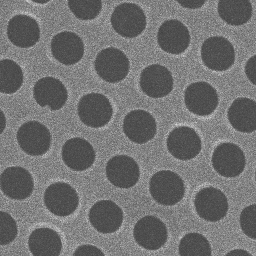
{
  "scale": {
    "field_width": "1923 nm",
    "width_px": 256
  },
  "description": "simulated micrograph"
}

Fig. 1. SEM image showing a regular array of holes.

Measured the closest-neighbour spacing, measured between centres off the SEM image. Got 0.356 microns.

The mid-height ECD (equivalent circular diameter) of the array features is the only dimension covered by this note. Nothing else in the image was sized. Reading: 255 nm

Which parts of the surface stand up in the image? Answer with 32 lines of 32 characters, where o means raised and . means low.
ooooooooo....oo..oooooo..oo....o
ooooooooo...oo....ooooooooo.....
o...oooooooooo....ooo.oooooo...o
o....ooooooooo....oo...ooooooooo
o....oo...ooooo..ooo....oooooooo
oo..oo....oooooooooo....o....ooo
oooooo....ooo..oooooo..oo....ooo
.oooooo...oo....ooooooooo....oo.
...ooooooooo....oo...ooooo...oo.
...ooooooooo....oo....ooooooooo.
...o....oooooooooo....oo..oooooo
..oo....oooooooooo...oo....ooooo
oooo....oo....ooooooooo....oo..o
oooooo..oo....ooooooooo....oo...
.ooooooooo....oo...ooooooooo....
.oo..oooooo..oo....oooooooooo...
oo....oooooooooo...oo...oooooo..
oo....ooo..ooooo...oo....ooooooo
ooo...oo....ooooooooo....oo...oo
oooooooo....ooo.oooooo..ooo....o
oooooooo....o....oooooooooo....o
....ooooooooo....ooo..ooooo...oo
....oooooooooo...oo....ooooooooo
....oo...oooooo.ooo....ooooooooo
o...oo....ooooooooo....oo...oooo
oooooo....oo..oooooo..oo.....ooo
.ooooo...oo....oooooooooo...oo..
..ooooooooo....oo...oooooo.ooo..
..ooo.oooooo...oo....ooooooooo..
..oo...oooooooooo....oo..oooooo.
.ooo....ooooooooo....o....oooooo
oooo....o....ooooooooo....ooo..o